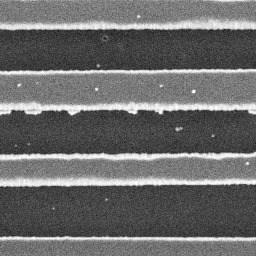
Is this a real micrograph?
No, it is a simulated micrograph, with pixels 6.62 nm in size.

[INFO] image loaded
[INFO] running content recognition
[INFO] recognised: lines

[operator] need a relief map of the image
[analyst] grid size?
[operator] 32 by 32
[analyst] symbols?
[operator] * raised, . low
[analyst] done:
********************************
********************************
********************************
*************************.******
................................
................................
................................
................................
................................
********************************
********************************
********************************
********************************
********************************
................................
................................
................................
................................
................................
********************************
********************************
********************************
********************************
................................
................................
................................
................................
................................
................................
................................
********************************
********************************